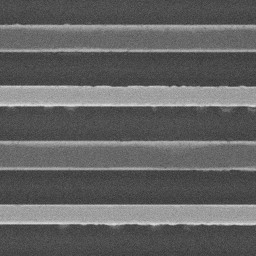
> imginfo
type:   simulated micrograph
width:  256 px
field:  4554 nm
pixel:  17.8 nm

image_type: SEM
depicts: lines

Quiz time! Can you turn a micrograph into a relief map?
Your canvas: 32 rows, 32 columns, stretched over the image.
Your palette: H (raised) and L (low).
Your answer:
LLLLLLLLLLLLLLLLLLLLLLLLLLLLLLLL
LLLLLLLLLLLLLLLLLLLLLLLLLLLLLLLL
LLLLLLLLLLLLLLLLLLLLLLLLLLLLLLLL
HHHHHHHHHHHHHHHHHHHHHHHHHHHHHHHH
HHHHHHHHHHHHHHHHHHHHHHHHHHHHHHHH
HHHHHHHHHHHHHHHHHHHHHHHHHHHHHHHH
LLLLLLLLLLLLLLLLLLLLLLLLLLLLLLLL
LLLLLLLLLLLLLLLLLLLLLLLLLLLLLLLL
LLLLLLLLLLLLLLLLLLLLLLLLLLLLLLLL
LLLLLLLLLLLLLLLLLLLLLLLLLLLLLLLL
LLLLLLLLLLLLLLLLLLLLLLLLLLLLLLLL
HHHHHHHHHHHHHHHHHHHHHHHHHHHHHHHH
HHHHHHHHHHHHHHHHHHHHHHHHHHHHHHHH
LLLLLLLLLLLLLLLLLLLLLLLLLLLLLLLL
LLLLLLLLLLLLLLLLLLLLLLLLLLLLLLLL
LLLLLLLLLLLLLLLLLLLLLLLLLLLLLLLL
LLLLLLLLLLLLLLLLLLLLLLLLLLLLLLLL
LLLLLLLLLLLLLLLLLLLLLLLLLLLLLLLL
HHHHHHHHHHHHHHHHHHHHHHHHHHHHHHHH
HHHHHHHHHHHHHHHHHHHHHHHHHHHHHHHH
HHHHHHHHHHHHHHHHHHHHHHHHHHHHHHHH
LLLLLLLLLLLLLLLLLLLLLLLLLLLLLLLL
LLLLLLLLLLLLLLLLLLLLLLLLLLLLLLLL
LLLLLLLLLLLLLLLLLLLLLLLLLLLLLLLL
LLLLLLLLLLLLLLLLLLLLLLLLLLLLLLLL
LLLLLLLLLLLLLLLLLLLLLLLLLLLLLLLL
HHHHHHHHHHHHHHHHHHHHHHHHHHHHHHHH
HHHHHHHHHHHHHHHHHHHHHHHHHHHHHHHH
LLLLLLLLLLLLLLLLLLLLLLLLLLLLLLLL
LLLLLLLLLLLLLLLLLLLLLLLLLLLLLLLL
LLLLLLLLLLLLLLLLLLLLLLLLLLLLLLLL
LLLLLLLLLLLLLLLLLLLLLLLLLLLLLLLL